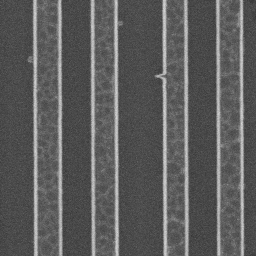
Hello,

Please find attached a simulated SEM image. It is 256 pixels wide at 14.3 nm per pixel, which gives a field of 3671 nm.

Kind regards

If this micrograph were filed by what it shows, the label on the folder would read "parallel lines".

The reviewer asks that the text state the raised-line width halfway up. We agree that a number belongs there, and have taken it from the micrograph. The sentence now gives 342 nanometers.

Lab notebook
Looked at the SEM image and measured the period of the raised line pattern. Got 872 nanometres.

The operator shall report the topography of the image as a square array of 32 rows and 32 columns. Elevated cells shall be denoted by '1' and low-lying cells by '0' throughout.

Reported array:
00001110000011100000011000011100
00001110000011100000011000011100
00001110000011100000011000011100
00001110000011100000011000011100
00001110000011100000011000011100
00001110000011100000011000011100
00001110000011100000011000011100
00001110000011100000011000011100
00001110000011100000011000011100
00001110000011100000111000011100
00001110000011100000011000011100
00001110000011100000011000011100
00001110000011100000011000011100
00000110000011100000011000011100
00001110000011100000011000011100
00001110000011100000011000011100
00001110000011100000011000011100
00000111000011000000011000011100
00000111000011100000011000011100
00000111000011100000011000011100
00000111000011100000011000011100
00000111000011100000011000011100
00001111000011100000011000011100
00000111000011100000011000011100
00001111000011100000011000011100
00000111000011100000011000011100
00000111000011100000011000011100
00000111000011100000011000011100
00000111000011100000011000011100
00000111000011100000011000011100
00001111000011100000011000011100
00001111000011100000011000011100